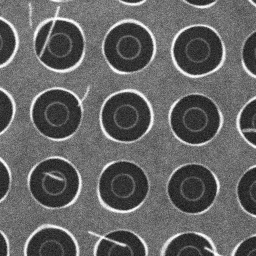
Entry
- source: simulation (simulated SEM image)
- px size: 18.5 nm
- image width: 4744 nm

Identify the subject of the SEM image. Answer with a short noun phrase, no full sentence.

an array of small figures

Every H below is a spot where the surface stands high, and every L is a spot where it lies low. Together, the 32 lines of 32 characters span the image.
HHHHHHHHHHHHHHHHLHHHHHHHLLHHHHHH
HHHHHHHHHHHHHHHHHHHHHHHHHHHHHHHH
HHHHHHLLHHHHHHHHHHHHHHHHHHHHHHHH
LLHHHLLLLLHHHHLLLLHHHHHLLLHHHHHH
LLHHLLLLLLHHHLLLLLLHHHLLLLLHHHHL
LLHHLLLLLLLHHLLLLLLHHHLLLLLLHHLL
LLHHLLLLLLHHHLLLLLLHHHLLLLLLHHLL
LHHHHLLLLLHHHLLLLLLHHHLLLLLLHHLL
HHHHHHLLLHHHHHLLLLHHHHLLLLLHHHHL
HHHHHHHHHHHHHHHHHHHHHHHHLHHHHHHH
HHHHHHHHHHHHHHHHHHHHHHHHHHHHHHHH
LHHHHHLLLHHHHHHLLHHHHHHHHHHHHHHH
LHHHLLLLLLHHHLLLLLHHHHLLLLHHHHHL
LLHHLLLLLLHHHLLLLLLHHHLLLLLHHHLL
LLHHLLLLLLHHHLLLLLLHHLLLLLLLHHLL
LHHHLLLLLLHHHLLLLLLHHLLLLLLLHHLL
HHHHHLLLLHHHHLLLLLHHHHLLLLLHHHLL
HHHHHHHHHHHHHHLLLHHHHHHLLLHHHHHL
HHHHHHHHHHHHHHHHHHHHHHHHHHHHHHHH
HHHHHHHHHHHHHHHHHHHHHHHHHHHHHHHH
LHHHHLLLLHHHHHLLLHHHHHHHHHHHHHHH
LHHHLLLLLLHHHLLLLLHHHHLLLLHHHHHL
LHHHLLLLLLHHLLLLLLHHHLLLLLLHHHLL
LHHHLLLLLLHHLLLLLLLHHLLLLLLHHHLL
LHHHLLLLLLHHLLLLLLHHHLLLLLLHHHLL
HHHHHLLLLHHHHLLLLLHHHHLLLLHHHHLL
HHHHHHHHHHHHHHHHHHHHHHHLLHHHHHHL
HHHHHHHHHHHHHHHHHHHHHHHHHHHHHHHH
HHHHHLLHHHHHHHHHHHHHHHHHHHHHHHHH
LHHHLLLLLHHHHLLLLHHHHHLLLHHHHHHH
LHHLLLLLLLHHLLLLLLHHHLLLLLHHHHLL
LHHLLLLLLLHHLLLLLLHHLLLLLLLHHLLL